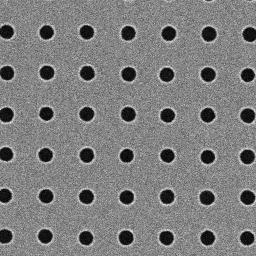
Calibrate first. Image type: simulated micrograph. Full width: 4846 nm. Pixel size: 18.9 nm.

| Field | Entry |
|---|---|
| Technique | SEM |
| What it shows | a regular array of holes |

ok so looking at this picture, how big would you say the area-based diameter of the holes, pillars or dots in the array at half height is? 286 nm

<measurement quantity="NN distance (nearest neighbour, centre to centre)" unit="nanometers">760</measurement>